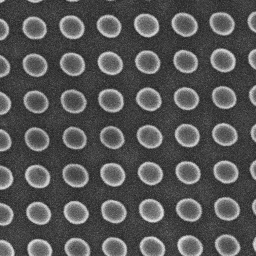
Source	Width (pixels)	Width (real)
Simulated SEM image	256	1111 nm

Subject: a regular array of raised bodies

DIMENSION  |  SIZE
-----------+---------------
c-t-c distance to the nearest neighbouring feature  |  160 nanometers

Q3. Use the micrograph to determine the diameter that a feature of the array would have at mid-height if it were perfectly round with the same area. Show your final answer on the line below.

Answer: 22.3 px